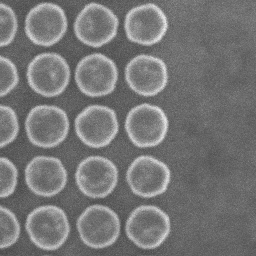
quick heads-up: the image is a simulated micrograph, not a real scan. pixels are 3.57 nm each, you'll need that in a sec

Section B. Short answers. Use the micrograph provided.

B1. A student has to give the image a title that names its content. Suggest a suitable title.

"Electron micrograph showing a regular array of raised bodies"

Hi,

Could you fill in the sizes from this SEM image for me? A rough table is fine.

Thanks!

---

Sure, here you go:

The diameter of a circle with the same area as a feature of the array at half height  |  0.145 micrometres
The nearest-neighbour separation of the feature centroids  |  178 nm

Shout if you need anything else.